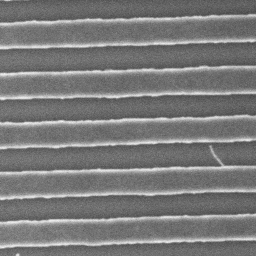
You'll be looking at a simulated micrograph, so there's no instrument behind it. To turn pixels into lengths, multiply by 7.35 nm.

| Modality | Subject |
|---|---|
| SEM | lines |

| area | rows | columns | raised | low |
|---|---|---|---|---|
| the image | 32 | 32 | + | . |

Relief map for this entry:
................................
................................
..........+++.++++++++++++++++++
++++++++++++++++++++++++++++++++
++++++++++++++++++++++++++++++++
++++++++++++++++++++++..........
................................
................................
........................++++++++
++++++++++++++++++++++++++++++++
++++++++++++++++++++++++++++++++
++++++++++++++++++++++++++++++++
................................
................................
.............................+++
++++++++++++++++++++++++++++++++
++++++++++++++++++++++++++++++++
++++++++++++++++++++++++++++++++
+...............................
................................
................................
..++++++++++++++++++++++++++++++
++++++++++++++++++++++++++++++++
++++++++++++++++++++++++++++++++
++++++++........................
................................
................................
............++++++++++++++++++++
++++++++++++++++++++++++++++++++
++++++++++++++++++++++++++++++++
+++++++++++++++.................
................................